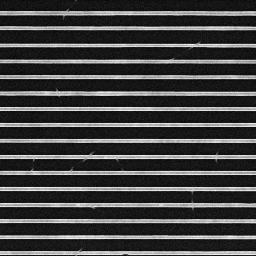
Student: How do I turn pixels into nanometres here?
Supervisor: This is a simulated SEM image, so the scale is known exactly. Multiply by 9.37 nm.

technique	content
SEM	parallel lines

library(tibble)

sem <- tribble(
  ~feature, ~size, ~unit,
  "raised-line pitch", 150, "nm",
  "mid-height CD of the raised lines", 30.4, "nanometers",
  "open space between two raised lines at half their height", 118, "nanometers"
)